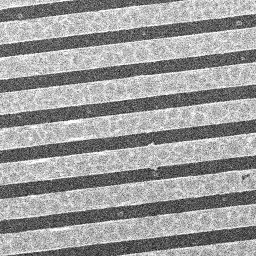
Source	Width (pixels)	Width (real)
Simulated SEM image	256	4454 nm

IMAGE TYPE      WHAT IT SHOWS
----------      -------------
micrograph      parallel lines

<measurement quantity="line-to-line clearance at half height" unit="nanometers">248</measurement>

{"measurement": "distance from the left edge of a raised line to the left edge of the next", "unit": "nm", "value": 609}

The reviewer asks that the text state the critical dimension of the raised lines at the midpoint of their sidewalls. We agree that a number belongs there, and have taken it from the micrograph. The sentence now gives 361 nm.